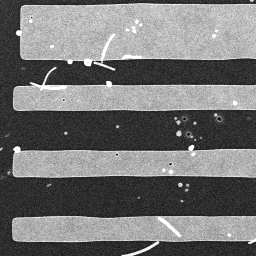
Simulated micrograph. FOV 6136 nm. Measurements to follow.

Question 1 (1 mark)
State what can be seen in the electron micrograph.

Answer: groups of lines, slits or small figures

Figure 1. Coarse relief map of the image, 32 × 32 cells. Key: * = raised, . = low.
...............................*
...*****************************
...*****************************
..******************************
..******************************
...*****************************
...*****************************
........*****...................
................................
................................
.............*..................
..******************************
..******************************
..******************************
................................
................................
................................
................................
................................
..******************************
..******************************
..******************************
................................
................................
................................
................................
................................
..******************************
..******************************
..******************************
................................
................................